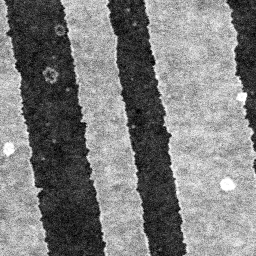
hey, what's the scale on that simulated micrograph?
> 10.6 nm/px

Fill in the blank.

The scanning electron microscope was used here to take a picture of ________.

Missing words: one or a few lines or trenches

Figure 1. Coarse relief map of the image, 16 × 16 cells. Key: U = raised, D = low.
DDDDUUUDDUUUUUDD
DDDDUUUDDUUUUUUD
UDDDUUUDDUUUUUUD
UDDDDUUDDDUUUUUD
UDDDDUUDDDUUUUUD
UDDDDUUUDDUUUUUD
UDDDDUUUDDUUUUUD
UDDDDUUUDDUUUUUD
UUDDDUUUDDDUUUUU
UUDDDDUUDDDUUUUU
UUDDDDUUDDDUUUUU
UUDDDDUUUDDUUUUU
UUDDDDUUUDDUUUUU
UUUDDDUUUDDUUUUU
UUUDDDUUUDDUUUUU
UUUDDDDUUDDDUUUU